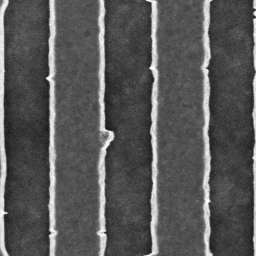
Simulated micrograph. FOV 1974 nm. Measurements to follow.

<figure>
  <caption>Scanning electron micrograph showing one or a few lines or trenches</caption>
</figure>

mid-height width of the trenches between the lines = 388 nm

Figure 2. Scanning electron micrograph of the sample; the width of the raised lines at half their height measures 396 nanometres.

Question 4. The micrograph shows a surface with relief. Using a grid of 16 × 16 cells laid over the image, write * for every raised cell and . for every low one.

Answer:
...***....***...
...***....***...
...***....***...
...***....***...
...***....***...
...***....***...
...***....***...
...***....***...
...****...***...
...****...***...
...***....***...
...***....***...
...***....***...
...***....***...
...***....***...
...***....***...